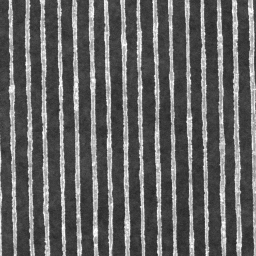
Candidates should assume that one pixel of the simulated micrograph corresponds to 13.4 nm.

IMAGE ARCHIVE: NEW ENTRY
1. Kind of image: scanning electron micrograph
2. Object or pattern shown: parallel lines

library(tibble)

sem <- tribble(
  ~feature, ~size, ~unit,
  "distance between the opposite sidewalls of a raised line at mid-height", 43.4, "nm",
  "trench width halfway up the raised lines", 0.17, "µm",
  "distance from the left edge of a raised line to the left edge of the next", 0.214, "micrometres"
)